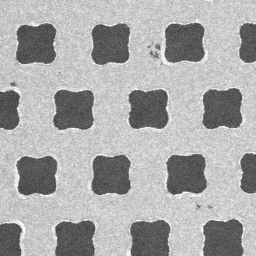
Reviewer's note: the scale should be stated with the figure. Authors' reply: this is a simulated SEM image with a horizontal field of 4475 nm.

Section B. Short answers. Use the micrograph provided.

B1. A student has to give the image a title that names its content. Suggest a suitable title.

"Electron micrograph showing a regular array of holes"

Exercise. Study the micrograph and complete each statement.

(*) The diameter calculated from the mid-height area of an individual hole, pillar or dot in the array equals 759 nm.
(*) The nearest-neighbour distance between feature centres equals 1290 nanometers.